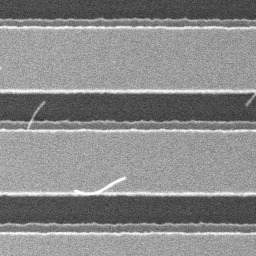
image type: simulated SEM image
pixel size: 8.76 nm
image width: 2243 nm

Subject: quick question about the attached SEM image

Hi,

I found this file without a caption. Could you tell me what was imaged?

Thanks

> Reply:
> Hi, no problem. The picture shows lines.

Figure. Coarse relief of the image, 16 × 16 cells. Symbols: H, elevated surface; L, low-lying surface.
LLLLLLLLLLLLLLLL
HHHHHHHHHHHHHHHH
HHHHHHHHHHHHHHHH
HHHHHHHHHHHHHHHH
HHHHHHHHHHHHHHHH
HHHHHHHHHHHHHHHH
LLLLLLLLLLLLLLLL
LLLLLLLLLLLLLLLL
HHHHHHHHHHHHHHHH
HHHHHHHHHHHHHHHH
HHHHHHHHHHHHHHHH
HHHHHHHHHHHHHHHH
LLLLLLLLLLLLLLLL
LLLLLLLLLLLLLLLL
HHHHHHHHHHHHHHHH
HHHHHHHHHHHHHHHH